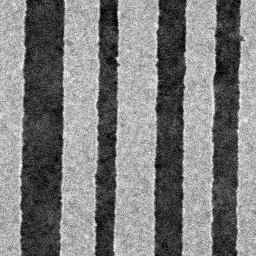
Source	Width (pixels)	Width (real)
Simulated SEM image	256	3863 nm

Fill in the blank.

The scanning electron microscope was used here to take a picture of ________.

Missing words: one or a few lines or trenches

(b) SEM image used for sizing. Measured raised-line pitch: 895 nm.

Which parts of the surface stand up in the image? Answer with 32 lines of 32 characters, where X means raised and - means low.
XXX-----XXXX---XXXXX---XXXX---XX
XXX-----XXXX---XXXXX---XXXX---XX
XXX-----XXXX---XXXXX---XXXX---XX
XXX-----XXXX---XXXXX---XXXX---XX
XXX-----XXXX---XXXX----XXXX---XX
XXX-----XXXX---XXXXX---XXXX---XX
XXX-----XXXX---XXXXX---XXXX---XX
XXX-----XXXX---XXXXX---XXXX---XX
XXX-----XXXX---XXXX----XXXX---XX
XXX-----XXXX---XXXXX---XXXX---XX
XXX-----XXXX---XXXXX---XXXX---XX
XXX-----XXXX---XXXXX---XXXX---XX
XXX-----XXXX---XXXX----XXXX---XX
XXX-----XXXX---XXXX----XXXX---XX
XXX-----XXXX---XXXX----XXXX---XX
XXX-----XXXX---XXXX----XXXX---XX
XXX-----XXXX---XXXXX---XXX----XX
XXX-----XXXX---XXXX----XXX----XX
XXX-----XXXX--XXXXX----XXXX---XX
XXX-----XXXX---XXXX----XXXX---XX
XXX-----XXXX--XXXXX----XXXX---XX
XXX-----XXXX---XXXX----XXXX---XX
XXX-----XXXX---XXXX----XXXX---XX
XXX-----XXXX---XXXX----XXX----XX
XXX-----XXXX---XXXX----XXX----XX
XX------XXXX---XXXX----XXX----XX
XXX-----XXXX--XXXXX----XXX----XX
XXX-----XXXX--XXXXX----XXX----XX
XX------XXXX--XXXXX----XXX----XX
XX------XXXX--XXXXX----XXX----XX
XXX-----XXXX--XXXXX----XXX----XX
XXX-----XXXX--XXXXX----XXX----XX